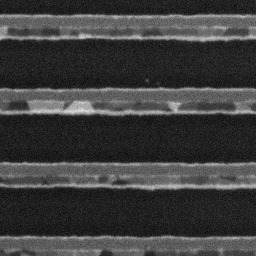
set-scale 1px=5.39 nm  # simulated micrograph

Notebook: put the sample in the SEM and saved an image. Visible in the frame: lines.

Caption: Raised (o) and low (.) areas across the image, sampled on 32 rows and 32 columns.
................................
................................
oooooooooooooooooooooooooooooooo
oooooooooooooooooooooooooooooooo
oooooooooooooooooooooooooooooooo
................................
................................
................................
................................
................................
................................
oooooooooooooooooooooooooooooooo
oooooooooooooooooooooooooooooooo
oooooooooooooooooooooooooooooooo
................................
................................
................................
................................
................................
................................
ooooo.ooooooooo.ooooooo..ooo..oo
oooooooooooooooooooooooooooooooo
oooooooooooooooooooooooooooooooo
................................
................................
................................
................................
................................
................................
................................
oooooooooooooooooooooooooooooooo
oooooooooooooooooooooooooooooooo